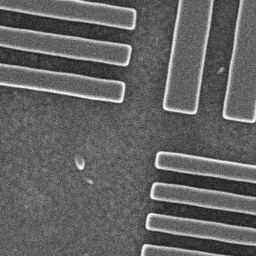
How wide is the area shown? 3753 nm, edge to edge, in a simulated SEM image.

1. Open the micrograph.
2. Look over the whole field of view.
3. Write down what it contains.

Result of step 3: groups of lines, slits or small figures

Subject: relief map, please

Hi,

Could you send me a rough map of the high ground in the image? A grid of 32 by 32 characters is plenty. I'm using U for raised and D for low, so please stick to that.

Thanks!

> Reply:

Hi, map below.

UUUUUUUUUUUUUDDDDDDDDDUUUUUDDDUU
DDUUUUUUUUUUUUUUUDDDDDUUUUDDDDUU
DDDDDDDDUUUUUUUUUDDDDDUUUUDDDDUU
UUDDDDDDDDDDDDDDDDDDDDUUUUDDDDUU
UUUUUUUUUDDDDDDDDDDDDDUUUUDDDUUU
UUUUUUUUUUUUUUUDDDDDDDUUUUDDDUUU
DDDDDUUUUUUUUUUUDDDDDUUUUUDDDUUU
DDDDDDDDDDDUUUUUDDDDDUUUUUDDDUUU
UUUDDDDDDDDDDDDDDDDDDUUUUDDDDUUU
UUUUUUUUUUDDDDDDDDDDDUUUUDDDDUUU
UUUUUUUUUUUUUUUDDDDDDUUUUDDDDUUU
DDDDDDDUUUUUUUUDDDDDDUUUUDDDUUUU
DDDDDDDDDDDDDUUDDDDDDUUUUDDDUUUU
DDDDDDDDDDDDDDDDDDDDDUUUUDDDUUUU
DDDDDDDDDDDDDDDDDDDDDDDDDDDDUUUU
DDDDDDDDDDDDDDDDDDDDDDDDDDDDDDDD
DDDDDDDDDDDDDDDDDDDDDDDDDDDDDDDD
DDDDDDDDDDDDDDDDDDDDDDDDDDDDDDDD
DDDDDDDDDDDDDDDDDDDDDDDDDDDDDDDD
DDDDDDDDDDDDDDDDDDDDUUUUDDDDDDDD
DDDDDDDDDDDDDDDDDDDDUUUUUUUUUUDD
DDDDDDDDDDDDDDDDDDDDDDDUUUUUUUUU
DDDDDDDDDDDDDDDDDDDDDDDDDDDDDUUU
DDDDDDDDDDDDDDDDDDDUUUUUDDDDDDDD
DDDDDDDDDDDDDDDDDDDUUUUUUUUUUUDD
DDDDDDDDDDDDDDDDDDDDDDDUUUUUUUUU
DDDDDDDDDDDDDDDDDDDDDDDDDDDDDDUU
DDDDDDDDDDDDDDDDDDUUUUUUUDDDDDDD
DDDDDDDDDDDDDDDDDDDUUUUUUUUUUUUD
DDDDDDDDDDDDDDDDDDDDDDDDUUUUUUUU
DDDDDDDDDDDDDDDDDDDDDDDDDDDDDDUU
DDDDDDDDDDDDDDDDDDUUUUUUUDDDDDDD